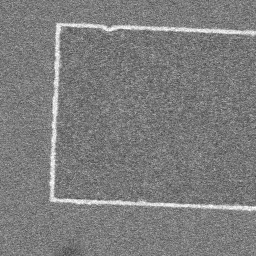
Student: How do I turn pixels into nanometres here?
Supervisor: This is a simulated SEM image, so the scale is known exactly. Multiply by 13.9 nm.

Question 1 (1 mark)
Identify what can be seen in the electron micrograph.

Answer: one or a few lines or trenches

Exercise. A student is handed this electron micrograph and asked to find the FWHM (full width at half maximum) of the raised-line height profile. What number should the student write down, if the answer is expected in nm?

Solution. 2440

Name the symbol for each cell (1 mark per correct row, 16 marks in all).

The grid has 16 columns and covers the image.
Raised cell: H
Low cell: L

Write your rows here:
LLLLLLLLLLLLLLLL
LLLLLLLLLLLLLLLL
LLLLHHHHHHHHHHHH
LLLLHHHHHHHHHHHH
LLLLHHHHHHHHHHHH
LLLLHHHHHHHHHHHH
LLLHHHHHHHHHHHHH
LLLHHHHHHHHHHHHH
LLLHHHHHHHHHHHHH
LLLHHHHHHHHHHHHH
LLLHHHHHHHHHHHHH
LLLHHHHHHHHHHHHH
LLLLHHHHHHHHHHHH
LLLLLLLLLLLLLLLL
LLLLLLLLLLLLLLLL
LLLLLLLLLLLLLLLL